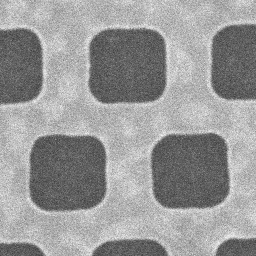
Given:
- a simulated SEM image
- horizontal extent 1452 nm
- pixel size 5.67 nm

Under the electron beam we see holes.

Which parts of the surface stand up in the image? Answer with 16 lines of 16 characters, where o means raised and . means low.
oooooooooooooooo
ooooooooooooooo.
..oooo....ooo...
...ooo....ooo...
...ooo....ooo...
...ooo....ooo...
.oooooo.oooooooo
oooooooooooooooo
ooo...oooo....oo
oo.....oo.....oo
oo.....oo.....oo
oo.....oo.....oo
oo....oooo....oo
oooooooooooooooo
oooooooooooooooo
..oooo....oooo..